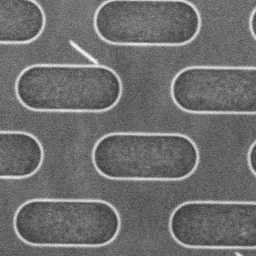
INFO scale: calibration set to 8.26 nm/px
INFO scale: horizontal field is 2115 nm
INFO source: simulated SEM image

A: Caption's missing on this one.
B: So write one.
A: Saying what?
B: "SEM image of groups of lines, slits or small figures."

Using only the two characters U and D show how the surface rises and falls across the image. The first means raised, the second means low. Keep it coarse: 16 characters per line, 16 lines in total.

DDUUUUDDDDDDUUUU
DDDUUUDDDDDDUUUU
DDUUUUUDDDDDUUUU
UUUUUUUUUUUUUUUU
UUDDDDDUUUUDDDDD
UDDDDDDUUUUDDDDD
UUDDDDDUUUUDDDDD
UUUUUUUUUUUUUUUU
DDUUUUUDDDDUUUUU
DDDUUUDDDDDDUUUU
DDUUUUDDDDDDUUUU
UUUUUUUUUUUUUUUU
UUUUUUUUUUUUUUUU
UDDDDDDUUUUDDDDD
UDDDDDDUUUUDDDDD
UUUUUUUUUUUUUUUU